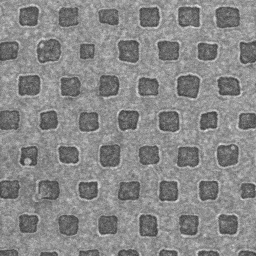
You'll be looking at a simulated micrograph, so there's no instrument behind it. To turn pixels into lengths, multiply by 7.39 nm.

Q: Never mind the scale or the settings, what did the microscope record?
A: a regular array of holes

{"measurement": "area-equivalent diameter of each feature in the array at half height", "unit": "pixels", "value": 21.8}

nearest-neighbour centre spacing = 0.289 um